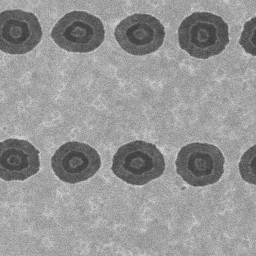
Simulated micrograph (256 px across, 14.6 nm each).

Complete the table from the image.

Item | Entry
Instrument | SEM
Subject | ring-shaped grooves with a dot in the middle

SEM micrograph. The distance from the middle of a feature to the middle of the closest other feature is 0.899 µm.